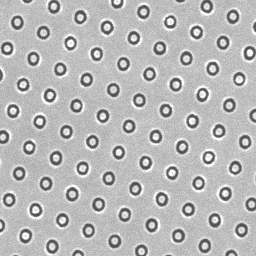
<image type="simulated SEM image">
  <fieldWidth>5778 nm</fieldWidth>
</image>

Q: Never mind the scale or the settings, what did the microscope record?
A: a regular array of ring-shaped grooves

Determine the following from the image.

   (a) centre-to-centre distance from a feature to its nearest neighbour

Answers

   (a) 627 nm